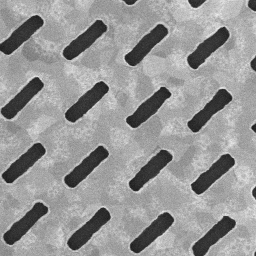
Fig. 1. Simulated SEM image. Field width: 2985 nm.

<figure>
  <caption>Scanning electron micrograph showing a regular array of holes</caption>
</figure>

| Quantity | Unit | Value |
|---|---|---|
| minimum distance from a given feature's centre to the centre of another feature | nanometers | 719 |